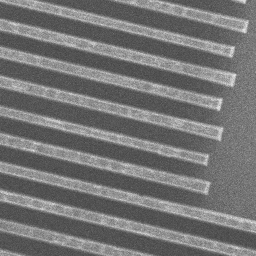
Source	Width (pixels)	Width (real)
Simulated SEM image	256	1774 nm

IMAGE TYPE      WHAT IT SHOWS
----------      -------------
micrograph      parallel lines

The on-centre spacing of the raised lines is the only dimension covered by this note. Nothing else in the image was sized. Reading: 192 nm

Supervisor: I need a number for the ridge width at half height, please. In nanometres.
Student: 76.7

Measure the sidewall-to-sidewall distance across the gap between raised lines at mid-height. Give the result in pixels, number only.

16.2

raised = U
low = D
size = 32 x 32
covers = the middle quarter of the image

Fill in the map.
UUUUDDDDDDDDDDDDDDDDDUUUUUUUUUUU
UUUUUUUUUDDDDDDDDDDDDDDDDUUUUUUU
DUUUUUUUUUUUUDDDDDDDDDDDDDDDDUUU
DDDDDUUUUUUUUUUUUDDDDDDDDDDDDDDD
DDDDDDDDDDUUUUUUUUUUUDDDDDDDDDDD
DDDDDDDDDDDDDDUUUUUUUUUUUDDDDDDD
DDDDDDDDDDDDDDDDDDUUUUUUUUUUUDDD
UUUUDDDDDDDDDDDDDDDDDDUUUUUUUUUU
UUUUUUUUDDDDDDDDDDDDDDDDDDUUUUUU
UUUUUUUUUUUUDDDDDDDDDDDDDDDDDDUU
DDDDUUUUUUUUUUUUDDDDDDDDDDDDDDDD
DDDDDDDDUUUUUUUUUUUUDDDDDDDDDDDD
DDDDDDDDDDDDUUUUUUUUUUUUDDDDDDDD
DDDDDDDDDDDDDDDDUUUUUUUUUUUUUDDD
UDDDDDDDDDDDDDDDDDDDUUUUUUUUUUUU
UUUUUDDDDDDDDDDDDDDDDDDDDUUUUUUU
UUUUUUUUUDDDDDDDDDDDDDDDDDDDDUUU
DDDUUUUUUUUUUDDDDDDDDDDDDDDDDDDD
DDDDDDDUUUUUUUUUUUDDDDDDDDDDDDDD
DDDDDDDDDDDUUUUUUUUUUUDDDDDDDDDD
DDDDDDDDDDDDDDDUUUUUUUUUUUDDDDDD
UUDDDDDDDDDDDDDDDDDDUUUUUUUUUUDD
UUUUUUDDDDDDDDDDDDDDDDDUUUUUUUUU
UUUUUUUUUUDDDDDDDDDDDDDDDDDDUUUU
DDUUUUUUUUUUUUUDDDDDDDDDDDDDDDDD
DDDDDDUUUUUUUUUUUUUDDDDDDDDDDDDD
DDDDDDDDDDUUUUUUUUUUUUUDDDDDDDDD
DDDDDDDDDDDDDDDUUUUUUUUUUUUDDDDD
UDDDDDDDDDDDDDDDDDDUUUUUUUUUUUUD
UUUUUDDDDDDDDDDDDDDDDDDUUUUUUUUU
UUUUUUUUUUDDDDDDDDDDDDDDDDDUUUUU
DDUUUUUUUUUUUUDDDDDDDDDDDDDDDDDU